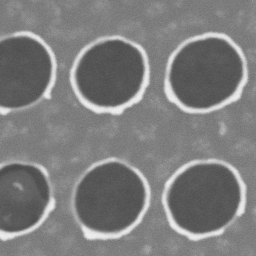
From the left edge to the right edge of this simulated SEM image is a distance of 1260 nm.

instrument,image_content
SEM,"holes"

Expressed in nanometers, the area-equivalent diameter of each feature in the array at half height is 345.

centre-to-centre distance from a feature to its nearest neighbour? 467 nm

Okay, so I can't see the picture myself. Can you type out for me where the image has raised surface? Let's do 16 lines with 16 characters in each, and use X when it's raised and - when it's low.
XXXXXXXXXXXXXXXX
XXXXXXXXXXXXXXXX
--XXXXXXXXXX--XX
---XX----XX----X
---XX----XX----X
---XX----XX----X
--XXXX--XXXX-XXX
XXXXXXXXXXXXXXXX
XXXXXXXXXXXXXXXX
XXXXXXXXXXXXXXXX
--XXXX--XXXX--XX
---XX----XX----X
---XX----XX----X
---XX----XX----X
XXXXXXXXXXXX-XXX
XXXXXXXXXXXXXXXX